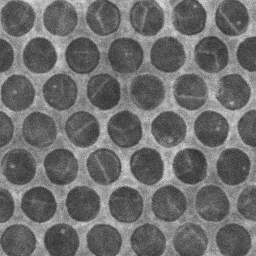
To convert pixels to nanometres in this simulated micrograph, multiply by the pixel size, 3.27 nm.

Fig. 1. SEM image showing a regular array of holes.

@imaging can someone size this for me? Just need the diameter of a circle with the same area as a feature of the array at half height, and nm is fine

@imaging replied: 121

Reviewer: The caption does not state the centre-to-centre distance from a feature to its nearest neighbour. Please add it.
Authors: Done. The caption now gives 139 nanometres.